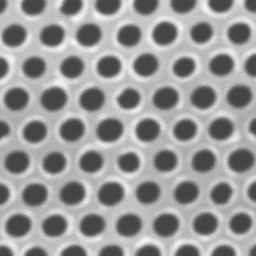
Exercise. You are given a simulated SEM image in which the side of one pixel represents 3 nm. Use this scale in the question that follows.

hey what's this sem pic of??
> a regular array of holes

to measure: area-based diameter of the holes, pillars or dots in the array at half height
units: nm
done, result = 72.7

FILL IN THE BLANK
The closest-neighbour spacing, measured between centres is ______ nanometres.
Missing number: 108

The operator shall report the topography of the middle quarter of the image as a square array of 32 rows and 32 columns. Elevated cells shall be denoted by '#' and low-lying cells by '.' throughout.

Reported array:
.....###......###.......###.....
.....###......###......####.....
....####.....#####....#####.....
#..##########################.##
################################
################################
#####....######...#####.....####
.###......####.....###.......###
.###......###......###.......###
.###......###......###.......###
####......####....#####.....####
#####....######..#######..######
################################
##.#############################
.....####.....#####....######...
.....###.......###......###.....
.....###.......###......###.....
.....###.......###......###.....
....#####.....####.....#####....
##########...#######.###########
################################
#########################.######
#####....######...#####.....####
####......####.....###......####
.###......###......###......####
####......####.....####.....####
####.....#####....#####....#####
################################
################################
##.########..########.#######...
.....####......####.....####....
.....####......###......####....